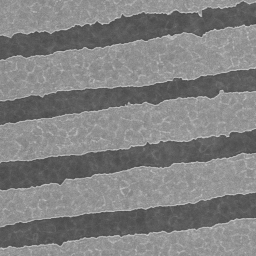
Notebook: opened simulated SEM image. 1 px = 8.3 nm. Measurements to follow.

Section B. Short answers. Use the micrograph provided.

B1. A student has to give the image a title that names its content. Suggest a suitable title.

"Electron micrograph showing one or a few lines or trenches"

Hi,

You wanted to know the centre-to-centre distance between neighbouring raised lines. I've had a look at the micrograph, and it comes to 521 nm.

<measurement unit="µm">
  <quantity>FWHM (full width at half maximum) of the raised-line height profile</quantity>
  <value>0.333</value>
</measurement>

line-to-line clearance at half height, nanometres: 198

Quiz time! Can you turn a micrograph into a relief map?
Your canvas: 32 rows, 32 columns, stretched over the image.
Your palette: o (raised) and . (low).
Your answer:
oooooooooooooooooooooooooooooo..
ooooooooooooooooooooo..oo.......
oooooooooooooo..................
ooooooooo...................oooo
.....................ooooooooooo
...............ooooooooooooooooo
.......ooooooooooooooooooooooooo
oooooooooooooooooooooooooooooooo
oooooooooooooooooooooooooooooooo
ooooooooooooooooooooooooo.......
ooooooooooooooooooo.............
ooooooo.........................
o....................ooooooooooo
..............oooooooooooooooooo
.......ooooooooooooooooooooooooo
.ooooooooooooooooooooooooooooooo
ooooooooooooooooooooooooooooo...
oooooooooooooooooooooooo.....o..
oooooooooooooooo.............o..
ooooooo......................ooo
......................oooooooooo
...............ooooooooooooooooo
........oooooooooooooooooooooooo
....oooooooooooooooooooooooooooo
oooooooooooooooooooooooooooo....
ooooooooooooooooooooooo.........
ooooooooooooo...................
oooo.........................ooo
.........................ooooooo
..............o.oooooooooooooooo
........oooooooooooooooooooooooo
oooooooooooooooooooooooooooooooo